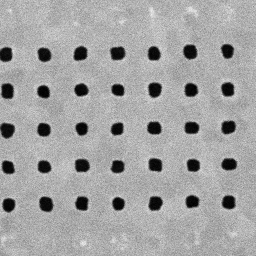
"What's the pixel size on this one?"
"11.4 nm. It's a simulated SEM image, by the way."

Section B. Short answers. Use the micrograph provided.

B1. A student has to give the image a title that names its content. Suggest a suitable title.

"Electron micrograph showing a regular array of holes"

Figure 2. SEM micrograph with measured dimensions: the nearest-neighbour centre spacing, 0.417 microns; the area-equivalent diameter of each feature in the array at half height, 165 nm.